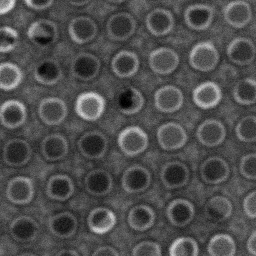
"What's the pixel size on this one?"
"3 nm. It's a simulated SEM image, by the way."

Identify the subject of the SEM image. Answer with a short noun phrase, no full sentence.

a regular array of raised bodies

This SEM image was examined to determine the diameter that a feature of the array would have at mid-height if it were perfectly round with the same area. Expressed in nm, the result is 78.1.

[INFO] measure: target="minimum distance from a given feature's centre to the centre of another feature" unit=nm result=114